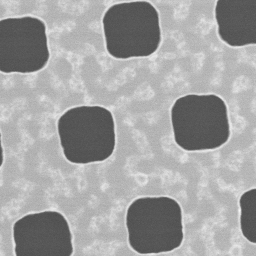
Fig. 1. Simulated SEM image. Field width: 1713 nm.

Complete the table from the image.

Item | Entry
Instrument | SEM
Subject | holes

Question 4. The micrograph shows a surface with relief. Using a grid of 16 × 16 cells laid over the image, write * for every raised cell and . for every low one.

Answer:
*******...***...
...***....****..
...****...****..
...****..*******
..**************
****************
***********...**
****...****...**
****...****...**
****...*********
****************
****************
*********..****.
**..****...****.
*...****...****.
*....***...*****